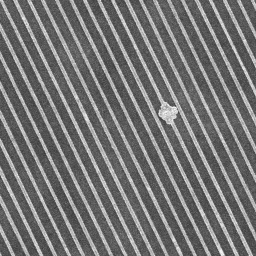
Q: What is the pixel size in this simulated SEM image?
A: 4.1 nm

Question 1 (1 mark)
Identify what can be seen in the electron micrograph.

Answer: parallel lines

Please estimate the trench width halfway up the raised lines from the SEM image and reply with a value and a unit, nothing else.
40.1 nanometres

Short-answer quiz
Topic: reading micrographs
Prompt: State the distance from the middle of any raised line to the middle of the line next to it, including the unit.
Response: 51.4 nm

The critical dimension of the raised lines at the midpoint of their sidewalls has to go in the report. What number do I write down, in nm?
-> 11.5